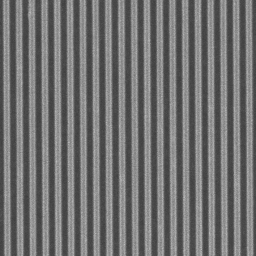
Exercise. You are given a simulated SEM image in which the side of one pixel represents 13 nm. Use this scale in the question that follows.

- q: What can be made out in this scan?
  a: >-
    parallel lines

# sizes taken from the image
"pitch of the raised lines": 166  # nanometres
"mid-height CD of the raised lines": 78.1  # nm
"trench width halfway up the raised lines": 89.5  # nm